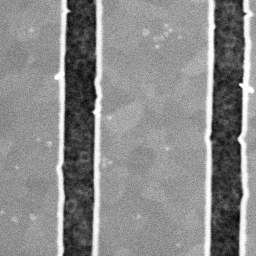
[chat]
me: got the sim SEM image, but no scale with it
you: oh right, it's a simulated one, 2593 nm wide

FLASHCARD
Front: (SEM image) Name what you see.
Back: one or a few lines or trenches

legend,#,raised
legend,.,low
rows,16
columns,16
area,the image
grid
####..#######..#
####..#######..#
####..#######..#
####..#######..#
####..#######..#
####..#######..#
####..#######..#
####..#######..#
####..#######..#
####..#######..#
####..#######..#
####..#######..#
####..#######..#
####..#######..#
####..#######..#
####..#######..#